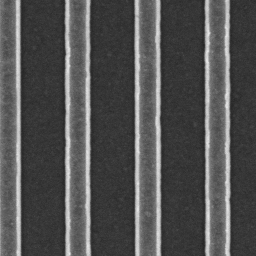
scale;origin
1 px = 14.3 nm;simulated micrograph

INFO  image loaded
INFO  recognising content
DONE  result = one or a few lines or trenches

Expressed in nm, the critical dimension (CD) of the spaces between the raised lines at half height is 691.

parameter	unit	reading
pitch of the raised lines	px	69.9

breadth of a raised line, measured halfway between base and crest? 21.4 pixels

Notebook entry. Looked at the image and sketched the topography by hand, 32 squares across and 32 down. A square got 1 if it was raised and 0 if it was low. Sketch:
11000000111000000111000000110000
11000000111000000111000000111000
11000000111000000111000000111000
11000000111000000111000000110000
11000000111000000111000000110000
11000000111000000111000000110000
11000000111000000111000000110000
11000000111000000111000000110000
11000000111000000111000000110000
11000000111000000111000000110000
11000000111000000111000000111000
11000000111000000111000000111000
11000000111000000111000000110000
11000000111000000111000000110000
11000000111000000111000000110000
11000000111000000111000000110000
11000000111000000111000000110000
11000000111000000111000000110000
11000000111000000111000000110000
11000000111000000111000000110000
11000000111000000111000000111000
11000000011000000111000000110000
11000000011000000111000000110000
11000000011000000111000000110000
11000000111000000111000000110000
11000000111000000111000000111000
11000000111000000111000000110000
11000000011000000111000000110000
11000000011000000111000000110000
11000000011000000111000000111000
11000000011000000111000000110000
11000000011000000111000000110000